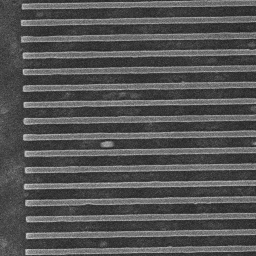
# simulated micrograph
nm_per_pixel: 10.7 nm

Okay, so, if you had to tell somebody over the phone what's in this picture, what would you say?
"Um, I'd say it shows parallel lines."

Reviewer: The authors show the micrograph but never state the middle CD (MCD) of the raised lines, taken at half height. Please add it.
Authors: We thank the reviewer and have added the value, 54.9 nanometres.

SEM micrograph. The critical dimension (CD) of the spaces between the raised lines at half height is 118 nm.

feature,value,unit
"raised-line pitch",0.175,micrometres